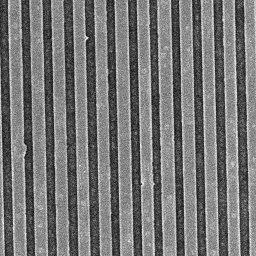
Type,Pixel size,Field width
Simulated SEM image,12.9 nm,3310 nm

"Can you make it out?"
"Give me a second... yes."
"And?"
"parallel lines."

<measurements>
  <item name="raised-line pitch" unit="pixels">21.4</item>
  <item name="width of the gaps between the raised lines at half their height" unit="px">9.24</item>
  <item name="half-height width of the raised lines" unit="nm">155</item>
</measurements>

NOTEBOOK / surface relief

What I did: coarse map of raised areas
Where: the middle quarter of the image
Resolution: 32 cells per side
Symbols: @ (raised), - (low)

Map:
---@@---@@@--@@@---@@---@@@--@@@
---@@---@@@--@@@---@@---@@@--@@@
---@@---@@@--@@@---@@---@@@--@@@
---@@---@@@--@@@---@@---@@@--@@@
---@@---@@@--@@@---@@---@@@--@@@
---@@@--@@@--@@@---@@@--@@@--@@@
---@@@--@@@--@@@---@@@--@@@--@@@
---@@@--@@@--@@@---@@@--@@@--@@@
---@@@--@@@--@@@---@@@--@@@--@@@
---@@@--@@@--@@@@--@@@--@@@--@@@
---@@@--@@@--@@@@--@@@--@@@---@@
---@@@--@@@---@@@--@@@--@@@---@@
---@@@--@@@---@@---@@@--@@@---@@
---@@@--@@@---@@---@@@--@@@---@@
---@@@--@@@---@@---@@@--@@@---@@
---@@@---@@---@@---@@@--@@@---@@
---@@@---@@---@@@--@@@--@@@---@@
---@@@---@@---@@---@@@--@@@---@@
---@@@---@@---@@---@@@--@@@---@@
---@@@---@@---@@---@@@--@@@---@@
@--@@@---@@---@@@--@@@--@@@---@@
@--@@@---@@---@@@--@@@--@@@---@@
@--@@@--@@@---@@@--@@@--@@@---@@
@--@@@--@@@---@@@--@@@--@@@---@@
@--@@@--@@@---@@@--@@@--@@@@--@@
@--@@@---@@---@@@--@@@---@@@--@@
@--@@@---@@---@@@--@@@---@@@--@@
@--@@@---@@---@@@--@@@---@@@--@@
@--@@@---@@---@@@--@@@---@@@--@@
@---@@---@@---@@@--@@@---@@@--@@
@---@@---@@---@@@--@@@---@@@--@@
@---@@---@@---@@@--@@@---@@@--@@